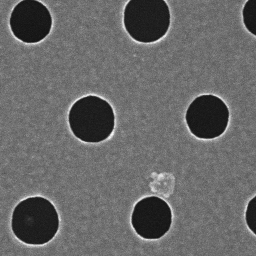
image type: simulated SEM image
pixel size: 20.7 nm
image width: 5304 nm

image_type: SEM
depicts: holes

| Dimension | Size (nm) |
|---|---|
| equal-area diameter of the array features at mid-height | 939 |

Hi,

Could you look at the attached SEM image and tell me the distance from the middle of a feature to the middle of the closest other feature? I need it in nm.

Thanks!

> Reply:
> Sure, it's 2390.